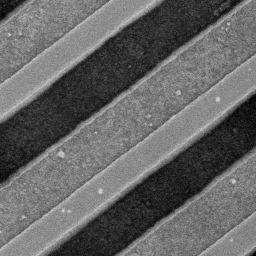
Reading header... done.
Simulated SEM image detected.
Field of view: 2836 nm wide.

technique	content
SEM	lines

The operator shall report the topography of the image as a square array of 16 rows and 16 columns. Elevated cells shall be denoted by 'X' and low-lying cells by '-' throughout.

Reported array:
-XXXXXXXX------X
XXXXXXXX------XX
XXXXXX------XXXX
XXXXX------XXXXX
XXXX------XXXXXX
XXX-----XXXXXXXX
X------XXXXXXXX-
------XXXXXXX---
----XXXXXXXX----
---XXXXXXXX-----
--XXXXXXXX-----X
-XXXXXXX-----XXX
XXXXXXX-----XXXX
XXXXXX-----XXXXX
XXXX-----XXXXXXX
XXX-----XXXXXXXX